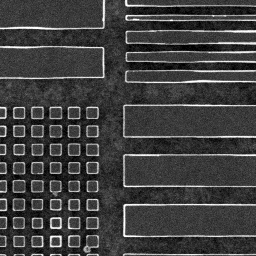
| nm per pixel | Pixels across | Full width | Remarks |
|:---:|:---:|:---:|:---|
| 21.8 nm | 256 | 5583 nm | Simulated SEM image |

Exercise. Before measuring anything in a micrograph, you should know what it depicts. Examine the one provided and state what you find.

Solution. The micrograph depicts groups of lines, slits or small figures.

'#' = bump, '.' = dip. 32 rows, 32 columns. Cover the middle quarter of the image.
##########......................
##########......................
##########.....#################
...............#################
................###############.
................................
................................
................................
................................
................................
...............#################
.###..##.......#################
.###..##.......#################
.###...........#################
...............#################
...............#################
.###..##.......#################
.###..##.......#################
................................
................................
.###..##........................
.###..##........................
.###..##........................
...............#################
...............#################
.###..##.......#################
.###..##.......#################
...............#################
...............#################
.###..##.......#################
.###..##........................
.###..##........................